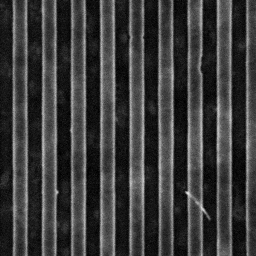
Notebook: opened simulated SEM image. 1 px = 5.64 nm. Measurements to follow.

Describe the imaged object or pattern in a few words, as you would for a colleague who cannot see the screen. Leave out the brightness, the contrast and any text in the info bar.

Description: parallel lines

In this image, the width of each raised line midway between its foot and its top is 73.3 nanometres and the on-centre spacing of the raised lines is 164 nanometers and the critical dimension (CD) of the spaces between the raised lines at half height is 88.8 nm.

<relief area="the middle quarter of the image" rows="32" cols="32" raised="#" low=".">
..###....###.....###....###....#
..###....###.....###....###....#
..###....####....###....###....#
..###....####....###....###....#
..###....####....###....###....#
..###....####....###....###....#
..###....####....###....###....#
..###....####....###....###....#
..###....###.....###....###....#
..###....###.....###....###....#
..###....###.....###....###....#
..###....###.....###....###....#
..###....###.....###....###....#
..###....###.....###....###....#
..###....###.....###....###....#
..###....###.....###....###....#
..###....###.....###....###....#
..###....####....###....###....#
..###....###.....###....###....#
..###....###.....###....###....#
..###....###.....###....###....#
..###....###.....###....###....#
..###....###.....###....###....#
..###....###.....###....###....#
..###....###.....###....###....#
..###....###.....###....###....#
..###....###.....###....###....#
..###....###.....###....###....#
..###....###.....###....###....#
..###....###.....###....###....#
..###....###.....###....###....#
..###....###.....###....###....#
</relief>